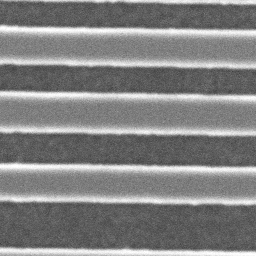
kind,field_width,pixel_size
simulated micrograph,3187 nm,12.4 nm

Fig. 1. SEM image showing lines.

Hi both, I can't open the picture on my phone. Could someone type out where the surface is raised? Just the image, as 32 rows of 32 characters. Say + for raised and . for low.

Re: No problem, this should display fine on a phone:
................................
................................
................................
................................
++++++++++++++++++++++++++++++++
++++++++++++++++++++++++++++++++
++++++++++++++++++++++++++++++++
++++++++++++++++++++++++++++++++
................................
................................
................................
................................
++++++++++++++++++++++++++++++++
++++++++++++++++++++++++++++++++
++++++++++++++++++++++++++++++++
++++++++++++++++++++++++++++++++
...........+++++++++++++++++++++
................................
................................
................................
................................
++++++++++++++++++++++++++++++++
++++++++++++++++++++++++++++++++
++++++++++++++++++++++++++++++++
++++++++++++++++++++++++++++++++
................................
................................
................................
................................
................................
................................
++++++++++++++++++++.+..........